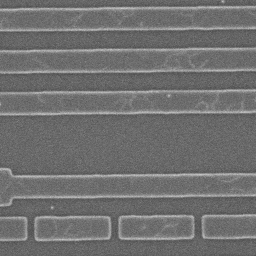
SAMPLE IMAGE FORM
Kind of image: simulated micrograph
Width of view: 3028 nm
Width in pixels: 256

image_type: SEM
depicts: wiring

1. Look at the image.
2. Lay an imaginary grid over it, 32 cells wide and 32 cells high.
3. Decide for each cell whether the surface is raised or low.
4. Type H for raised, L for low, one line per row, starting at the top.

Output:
LLLLLLLLLLLLLLLLLLLLLLLLLLLLLLLL
HHHHHHHHHHHHHHHHHHHHHHHHHHHHHHHH
HHHHHHHHHHHHHHHHHHHHHHHHHHHHHHHH
HHHHHHHHHHHHHHHHHHHHHHHHHHHHHHHH
LLLLLLLLLLLLLLLLLLLLLLLLLLLLLLLL
LLLLLLLLLLLLLLLLLLLLLLLLLLLLLLLL
HHHHHHHHHHHHHHHHHHHHHHHHHHHHHHHH
HHHHHHHHHHHHHHHHHHHHHHHHHHHHHHHH
HHHHHHHHHHHHHHHHHHHHHHHHHHHHHHHH
LLLLLLLLLLLLLLLLLLLLLLLLLLLLLLLL
LLLLLLLLLLLLLLLLLLLLLLLLLLLLLLLL
LLLLLLLLLLLLLLLLLLHHHHHHHHHHHHHH
HHHHHHHHHHHHHHHHHHHHHHHHHHHHHHHH
HHHHHHHHHHHHHHHHHHHHHHHHHHHHHHHH
LLLLLLLLLLLLLLLLLLLLLLLLLLLLLLLL
LLLLLLLLLLLLLLLLLLLLLLLLLLLLLLLL
LLLLLLLLLLLLLLLLLLLLLLLLLLLLLLLL
LLLLLLLLLLLLLLLLLLLLLLLLLLLLLLLL
LLLLLLLLLLLLLLLLLLLLLLLLLLLLLLLL
LLLLLLLLLLLLLLLLLLLLLLLLLLLLLLLL
LLLLLLLLLLLLLLLLLLLLLLLLLLLLLLLL
HLLLLLLLLLLLLLLLLLLLLLLLLLLLLLLL
HHHHHHHHHHHHHHHHHHHHHHHHHHHHHHHH
HHHHHHHHHHHHHHHHHHHHHHHHHHHHHHHH
HHHHHHHHHHHHHHHHHHHHHHHHLLLLLLLL
HLLLLLLLLLLLLLLLLLLLLLLLLLLLLLLL
LLLLLLLLLLLLLLLLLLLLLLLLLLLLLLLL
HHHLHHHHHHHHHHLHHHHHHHHHLHHHHHHH
HHHLHHHHHHHHHHLHHHHHHHHHLHHHHHHH
HHHLHHHHHHHHHHLHHHHHHHHHLHHHHHHH
LLLLLLLLLLLLLLLLLLLLLLLLLLLLLLLL
LLLLLLLLLLLLLLLLLLLLLLLLLLLLLLLL